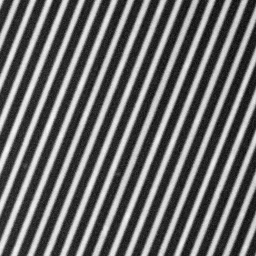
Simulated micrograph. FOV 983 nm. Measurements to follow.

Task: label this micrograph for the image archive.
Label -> parallel lines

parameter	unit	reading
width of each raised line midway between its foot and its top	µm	0.0192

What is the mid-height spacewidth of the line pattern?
9.9 px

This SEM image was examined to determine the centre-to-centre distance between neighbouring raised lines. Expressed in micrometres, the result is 0.0582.